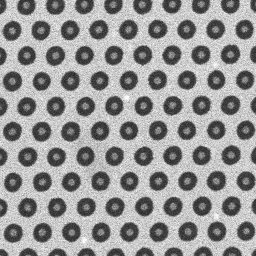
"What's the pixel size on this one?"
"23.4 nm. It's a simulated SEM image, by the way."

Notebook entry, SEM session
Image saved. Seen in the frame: a regular array of ring-shaped grooves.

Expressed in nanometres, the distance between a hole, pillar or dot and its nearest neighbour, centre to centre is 672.